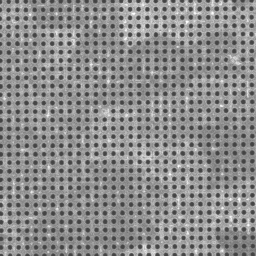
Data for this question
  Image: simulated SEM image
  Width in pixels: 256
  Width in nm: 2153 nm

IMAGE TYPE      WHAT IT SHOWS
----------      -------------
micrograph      a regular array of holes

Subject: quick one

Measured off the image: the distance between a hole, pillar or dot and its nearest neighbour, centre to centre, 69.9 nm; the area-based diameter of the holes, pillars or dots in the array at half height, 36.8 nanometres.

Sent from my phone